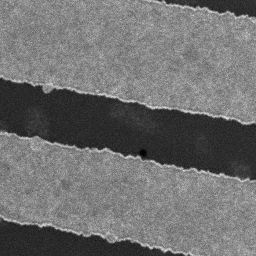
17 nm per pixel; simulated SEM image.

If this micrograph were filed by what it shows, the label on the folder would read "one or a few lines or trenches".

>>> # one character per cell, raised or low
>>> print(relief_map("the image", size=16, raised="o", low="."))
oooooooooooo....
oooooooooooooooo
oooooooooooooooo
oooooooooooooooo
oooooooooooooooo
...ooooooooooooo
.........ooooooo
...............o
o...............
ooooooo.........
ooooooooooo.....
oooooooooooooooo
oooooooooooooooo
oooooooooooooooo
.....ooooooooooo
..........oooooo